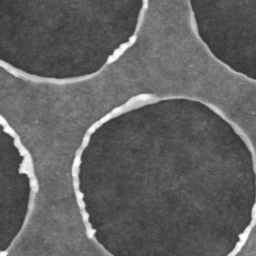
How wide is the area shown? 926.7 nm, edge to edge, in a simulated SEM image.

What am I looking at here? holes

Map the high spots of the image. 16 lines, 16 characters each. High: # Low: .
.........###....
.........###....
........#####...
.......######...
#.....#########.
################
#########....###
#######.......##
.#####.........#
.####...........
.####...........
..###...........
..###...........
..###...........
.#####.........#
######.........#